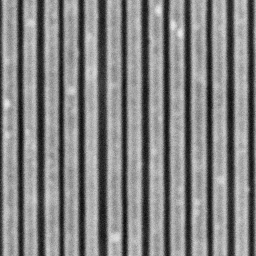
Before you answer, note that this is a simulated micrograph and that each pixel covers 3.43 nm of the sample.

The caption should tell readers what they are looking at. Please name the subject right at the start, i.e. parallel lines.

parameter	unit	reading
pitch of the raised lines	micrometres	0.072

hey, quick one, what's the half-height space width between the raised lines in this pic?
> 0.0261 micrometres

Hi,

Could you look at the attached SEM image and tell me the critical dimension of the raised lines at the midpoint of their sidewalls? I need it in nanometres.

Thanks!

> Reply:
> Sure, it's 45.8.